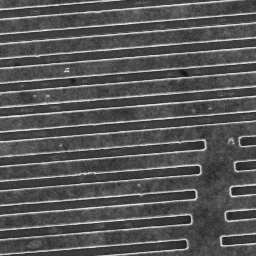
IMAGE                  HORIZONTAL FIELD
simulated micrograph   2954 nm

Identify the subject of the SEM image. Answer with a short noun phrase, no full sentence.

parallel lines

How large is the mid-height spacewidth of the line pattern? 0.103 microns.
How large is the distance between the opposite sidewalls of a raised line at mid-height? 183 nm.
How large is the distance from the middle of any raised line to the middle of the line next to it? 282 nanometers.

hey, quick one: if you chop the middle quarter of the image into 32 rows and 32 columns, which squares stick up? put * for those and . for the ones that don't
********************************
************************........
***********.....................
.............................***
.................***************
.....***************************
********************************
**************************......
**************..................
**..............................
...................*************
.......*************************
********************************
**************************......
**************..................
**..............................
...................*************
........*.**********************
********************************
******************************..
*****************...............
****............................
......................**********
..........**********************
********************************
*****************************.*.
*******************.............
****.*..........................
......................**********
............********************
********************************
*******************************.